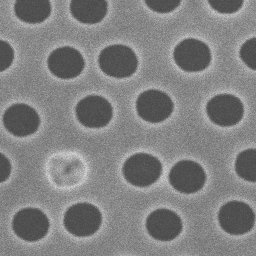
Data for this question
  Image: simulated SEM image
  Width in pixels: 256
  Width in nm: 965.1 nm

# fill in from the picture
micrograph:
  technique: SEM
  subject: a regular array of holes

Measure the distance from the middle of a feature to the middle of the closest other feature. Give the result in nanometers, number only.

202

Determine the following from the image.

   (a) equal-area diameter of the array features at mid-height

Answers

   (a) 133 nanometers